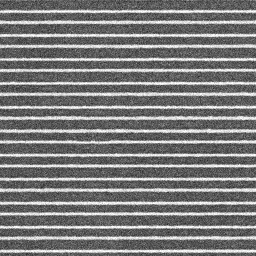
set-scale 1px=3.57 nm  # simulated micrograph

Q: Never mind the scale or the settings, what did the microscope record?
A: parallel lines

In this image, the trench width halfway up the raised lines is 0.035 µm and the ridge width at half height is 2.49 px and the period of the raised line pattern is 42.8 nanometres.